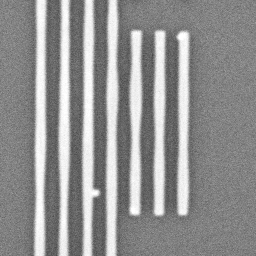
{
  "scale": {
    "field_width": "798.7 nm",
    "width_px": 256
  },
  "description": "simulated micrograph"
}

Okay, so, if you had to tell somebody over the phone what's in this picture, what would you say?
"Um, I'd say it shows groups of lines, slits or small figures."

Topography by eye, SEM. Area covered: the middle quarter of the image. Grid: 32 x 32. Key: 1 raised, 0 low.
10000110000110000110000110000110
10000110000110000110000110000110
10000110000110000110000110000110
10000110000110000110000110000110
10000110000110000110000110000110
10000110000110000110000110000110
10000110000110000110000110000110
10000110000110000110000110000110
10000110000110000110000110000110
10000110000110000110000110000110
10000110000110000110000110000110
10000110000110000110000110000110
10000110000110000110000110000110
10000110000110000110000110000110
10000110000110000110000110000110
10000110000110000110000110000110
10000110000110000110000110000110
10000110000110000110000110000110
10000110000110000110000110000110
10000110000110000110000110000110
10000110000110000110000110000110
10000110000110000110000110000110
10000110000110000110000110000110
10000110000110000110000110000110
10000110000110000110000110000110
10000110000110000110000110000110
10000110000110000110000110000110
10000110000110000110000110000110
10000110000110000110000110000110
10000110000110000110000110000110
10000110000110000110000110000110
10000110000110000110000110000110